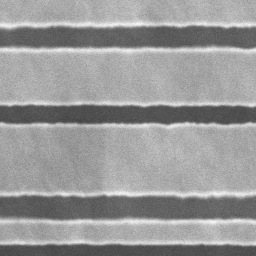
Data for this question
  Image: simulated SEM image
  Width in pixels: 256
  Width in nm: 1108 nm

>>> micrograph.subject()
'lines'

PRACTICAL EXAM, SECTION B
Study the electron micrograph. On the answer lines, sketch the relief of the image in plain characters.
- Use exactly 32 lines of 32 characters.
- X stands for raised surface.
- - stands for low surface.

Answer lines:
XXXXXXXXXXXXXXXXXXXXXXXXXXXXXXXX
XXXXXXXXXXXXXXXXXXXXXXXXXXXXXXXX
XXXXXXXXXXXXXXXXXXXXXXXXXXXXXXXX
--------------------------------
--------------------------------
--------------------------------
XXXXXXXXXXXXXXXXXXXXXXXXXXXXXXXX
XXXXXXXXXXXXXXXXXXXXXXXXXXXXXXXX
XXXXXXXXXXXXXXXXXXXXXXXXXXXXXXXX
XXXXXXXXXXXXXXXXXXXXXXXXXXXXXXXX
XXXXXXXXXXXXXXXXXXXXXXXXXXXXXXXX
XXXXXXXXXXXXXXXXXXXXXXXXXXXXXXXX
XXXXXXXXXXXXXXXXXXXXXXXXXXXXXXXX
--------------------------------
--------------------------------
X---XX-XXX---XXX--XX--XXXXX---XX
XXXXXXXXXXXXXXXXXXXXXXXXXXXXXXXX
XXXXXXXXXXXXXXXXXXXXXXXXXXXXXXXX
XXXXXXXXXXXXXXXXXXXXXXXXXXXXXXXX
XXXXXXXXXXXXXXXXXXXXXXXXXXXXXXXX
XXXXXXXXXXXXXXXXXXXXXXXXXXXXXXXX
XXXXXXXXXXXXXXXXXXXXXXXXXXXXXXXX
XXXXXXXXXXXXXXXXXXXXXXXXXXXXXXXX
XXXXXXXXXXXXXXXXXXXXXXXXXXXXXXXX
--------------------------------
--------------------------------
--------------------------------
--------------------------------
XXXXXXXXXXXXXXXXXXXXXXXXXXXXXXXX
XXXXXXXXXXXXXXXXXXXXXXXXXXXXXXXX
XXXXXX-XX--XXX-XXXXXXXXXXXXXXXXX
--------------------------------